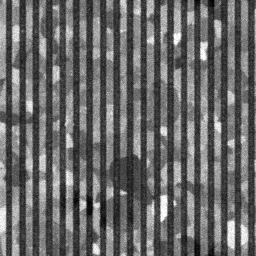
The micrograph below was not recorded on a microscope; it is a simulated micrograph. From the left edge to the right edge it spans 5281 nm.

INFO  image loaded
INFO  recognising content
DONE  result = parallel lines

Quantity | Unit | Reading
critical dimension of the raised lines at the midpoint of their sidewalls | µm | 0.126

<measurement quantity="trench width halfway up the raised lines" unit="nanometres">144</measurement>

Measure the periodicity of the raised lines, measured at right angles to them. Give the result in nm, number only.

278